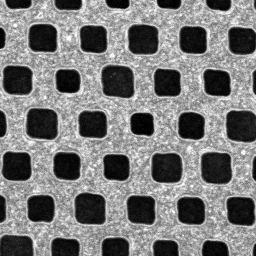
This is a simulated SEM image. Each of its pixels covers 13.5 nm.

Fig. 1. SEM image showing a regular array of holes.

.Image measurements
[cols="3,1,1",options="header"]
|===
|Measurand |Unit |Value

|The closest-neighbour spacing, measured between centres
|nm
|658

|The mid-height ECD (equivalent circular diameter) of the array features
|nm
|398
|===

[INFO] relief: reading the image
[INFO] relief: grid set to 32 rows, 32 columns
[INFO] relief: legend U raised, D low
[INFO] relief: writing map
UDDDUUUDDDUUUDDDUUUUDDDUUUDDDUUU
UUUUUUUUUUUUUUUUUUUUUUUUUUUUUUUU
UUUUUUUUUUUUUUUUUUUUUUUUUUUUUUUU
UUUUDDDUUUDDDUUUDDDUUUUDDUUUUDUU
DUUUDDDUUUDDDUUUDDDDUUDDDDUUUDDD
DUUUDDDUUUDDDUUUDDDDUUDDDDUUUDDD
UUUUUUUUUUUDDUUUDDDUUUUDDUUUUDDD
UUUUUUUUUUUUUUUUUUUUUUUUUUUUUUUU
UDDDUUUUUUUUUDDDUUUUUUUUUUUUUUUU
DDDDUUUDDDUUUDDDDUUDDDDUUDDDDUUU
DDDDUUUDDDUUUDDDDUUDDDDUUDDDDUUU
UDDDUUUUDUUUUDDDDUUDDDDUUUDDDUUU
UUUUUUUUUUUUUUUUUUUUUUUUUUUUUUUU
UUUUDUUUUUUUUUUUUUUUUUUUUUUUUUUU
DUUDDDDUUUDDDUUUUDDUUUUDDUUUDDDD
DUUDDDDUUUDDDUUUDDDUUUDDDDUUDDDD
DUUDDDDUUUDDDUUUUDDUUUDDDUUUDDDD
UUUUUUUUUUUUUUUUUUUUUUUUUUUUUDDD
UUUUUUUUUUUUUUUUUUUUUUUUUUUUUUUU
DDDDUUUDDDUUUDDDUUUDDDUUUDDDDUUU
DDDDUUUDDDUUUDDDUUUDDDDUUDDDDUUU
DDDDUUUDDDUUUDDDUUUDDDDUUDDDDUUU
UDDUUUUUDUUUUUDDUUUDDDUUUUDDDUUU
UUUUUUUUUUUUUUUUUUUUUUUUUUUUUUUU
UUUUDDUUUUDDDUUUUDUUUUUUUUUUUUUU
DUUDDDDUUDDDDUUUDDDUUUDDDDUUDDDD
DUUDDDDUUDDDDUUUDDDUUUDDDDUUDDDD
UUUUDDUUUUDDDUUUDDDUUUDDDDUUUDDD
UUUUUUUUUUUUUUUUUUUUUUUUUUUUUUUU
DDDUUUUUUUUUUUUUUUUUUUUUUUUUUUUU
DDDDUUDDDDUUUDDDUUUDDDUUUDDDUUUU
DDDDUUDDDDUUUDDDUUUDDDUUUDDDDUUU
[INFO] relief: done